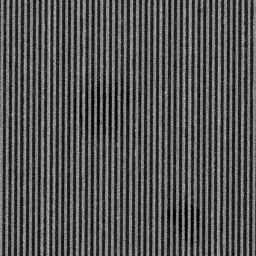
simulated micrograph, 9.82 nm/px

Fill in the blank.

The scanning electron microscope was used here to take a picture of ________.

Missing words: parallel lines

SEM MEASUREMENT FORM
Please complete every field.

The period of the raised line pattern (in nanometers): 57.7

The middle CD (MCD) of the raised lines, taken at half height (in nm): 24.6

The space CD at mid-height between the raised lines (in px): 3.75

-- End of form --